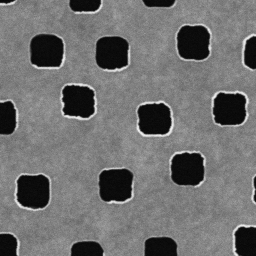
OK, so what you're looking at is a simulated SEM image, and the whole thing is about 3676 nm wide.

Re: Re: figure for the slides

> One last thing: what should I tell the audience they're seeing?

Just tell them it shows a regular array of holes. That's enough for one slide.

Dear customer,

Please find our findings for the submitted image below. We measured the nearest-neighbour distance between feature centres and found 860 nm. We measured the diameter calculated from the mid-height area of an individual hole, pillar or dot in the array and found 510 nanometers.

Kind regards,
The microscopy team